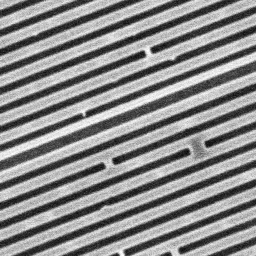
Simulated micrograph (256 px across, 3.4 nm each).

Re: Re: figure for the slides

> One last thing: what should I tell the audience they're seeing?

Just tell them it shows parallel lines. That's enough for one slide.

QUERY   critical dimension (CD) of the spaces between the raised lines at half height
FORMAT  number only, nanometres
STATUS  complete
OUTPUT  29.7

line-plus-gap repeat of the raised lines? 60.8 nm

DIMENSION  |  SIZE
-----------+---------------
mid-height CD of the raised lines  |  33.2 nanometers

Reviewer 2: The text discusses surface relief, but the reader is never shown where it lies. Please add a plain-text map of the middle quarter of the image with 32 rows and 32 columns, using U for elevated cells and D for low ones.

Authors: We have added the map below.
DDDUUUUUUDDDDDDUUUUUUDDDDDDDUUUU
UUUUUUUDDDDDUUUUUUUDDDDDDUUUUUUD
UUUUDDDDDDUUUUUUDDDDDDUUUUUUDDDD
UUDDDDDUUUUUUUDDDDDUUUUUUUDDDDDD
DDDDDUUUUUUDDDDDDUUUUUUDDDDDDUUU
DDUUUUUUUDDDDDUUUUUUUDDDDDUUUUUD
UUUUUUDDDDDDUUUUUUDDDDDDUUUUUDDD
UUUUDDDDDDUUUUUUDDDDDDUUUUDDDDDD
UDDDDDDUUUUUUDDDDDDUUUUUDDDDDDDU
DDDDDUUUUUUDDDDDDUUUUDDDDDDDDUUU
DDUUUUUUDDDDDDUUUUUDDDDDDDUUUUUU
UUUUUUDDDDDDUUUUDDDDDDDDUUUUUUDD
UUUDDDDDDUUUUUDDDDDDDUUUUUUUDDDD
DDDDDDUUUUUDDDDDDDDUUUUUUDDDDDDU
DDDUUUUUUDDDDDDDUUUUUUUDDDDDUUUU
DUUUUUDDDDDDDUUUUUUUDDDDDUUUUUUU
UUUDDDDDDDDUUUUUUDDDDDDUUUUUUUDD
UDDDDDDDUUUUUUUDDDDDDUUUUUUDDDDD
DDDDDDUUUUUUDDDDDDDUUUUUUDDDDDDU
DDDUUUUUUUDDDDDDUUUUUUUDDDDDUUUU
DUUUUUUDDDDDDUUUUUUUDDDDDUUUUUUU
UUUUUDDDDDDUUUUUUDDDDDDUUUUUUDDD
UUDDDDDDUUUUUUDDDDDDUUUUUUUDDDDD
DDDDDDUUUUUUDDDDDDUUUUUUDDDDDDUU
DDDUUUUUUDUUDDDUUUUUUUDDDDDUUUUU
UUUUUUUDDDUUUUUUUUUDDDDDDUUUUUUD
UUUUUDDDDDUUUUUUUDDDDDUUUUUUUDDD
UDDDDDDDUUUUUUDDDDDDUUUUUUDDDDDD
DDDDDUUUUUUUDDDDDUUUUUUUDDDDDDUU
DDDUUUUUUDDDDDDUUUUUUDDDDDDUUUUU
UUUUUUUDDDDDUUUUUUUDDDDDDUUUUUUD
UUUUDDDDDUUUUUUUDDDDDDUUUUUUDDDD